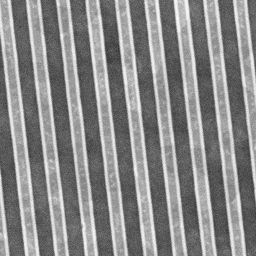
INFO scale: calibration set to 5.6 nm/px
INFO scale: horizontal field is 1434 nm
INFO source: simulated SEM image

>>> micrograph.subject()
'parallel lines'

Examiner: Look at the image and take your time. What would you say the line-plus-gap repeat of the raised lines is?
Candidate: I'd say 0.164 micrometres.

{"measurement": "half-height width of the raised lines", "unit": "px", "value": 11.1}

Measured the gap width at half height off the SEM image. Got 103 nanometers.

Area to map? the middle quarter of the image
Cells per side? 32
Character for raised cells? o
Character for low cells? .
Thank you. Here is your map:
ooo.....oo.....ooo....ooo.....oo
.oo.....oo.....ooo....ooo.....oo
.oo.....oo.....ooo.....oo.....oo
.oo.....ooo....ooo.....oo.....oo
.oo.....ooo....ooo.....oo.....oo
.oo.....ooo.....oo.....ooo....oo
.oo.....ooo.....oo.....ooo....oo
.oo.....ooo.....oo.....ooo.....o
.oo.....ooo.....oo.....ooo.....o
.ooo.....oo.....ooo....ooo.....o
.ooo.....oo.....ooo....ooo.....o
..oo.....oo.....ooo.....oo.....o
..oo.....ooo....ooo.....oo.....o
..oo.....ooo.....oo.....oo.....o
..oo.....ooo.....oo.....ooo....o
..ooo....ooo.....oo.....ooo....o
..ooo....ooo.....oo.....ooo.....
..ooo.....oo.....ooo....ooo.....
..ooo.....oo.....ooo....ooo.....
..ooo.....oo.....ooo.....oo.....
...oo.....oo.....ooo.....oo.....
...oo.....ooo....ooo.....oo.....
...oo.....ooo....ooo.....oo.....
...oo.....ooo.....oo.....ooo....
...oo.....ooo.....oo.....ooo....
...oo.....ooo.....oo.....ooo....
...ooo.....oo.....ooo....ooo....
...ooo.....oo.....ooo....ooo....
....oo.....oo.....ooo.....oo....
....oo.....oo.....ooo.....oo....
....oo.....ooo....ooo.....oo....
....oo.....ooo....ooo.....oo....